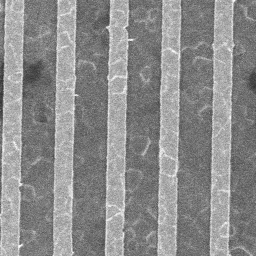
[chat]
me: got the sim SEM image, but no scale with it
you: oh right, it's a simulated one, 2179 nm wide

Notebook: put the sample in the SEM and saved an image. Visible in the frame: parallel lines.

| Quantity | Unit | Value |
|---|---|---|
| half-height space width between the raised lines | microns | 0.292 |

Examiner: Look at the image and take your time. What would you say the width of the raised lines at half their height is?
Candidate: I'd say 0.154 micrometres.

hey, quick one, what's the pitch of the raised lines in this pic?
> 446 nanometers